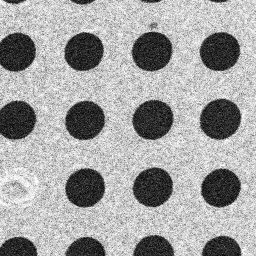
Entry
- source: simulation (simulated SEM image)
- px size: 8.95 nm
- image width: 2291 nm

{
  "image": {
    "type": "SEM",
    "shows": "a regular array of holes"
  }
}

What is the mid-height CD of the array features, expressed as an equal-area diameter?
0.359 microns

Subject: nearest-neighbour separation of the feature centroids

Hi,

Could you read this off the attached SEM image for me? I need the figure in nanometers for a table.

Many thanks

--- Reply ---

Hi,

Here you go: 605